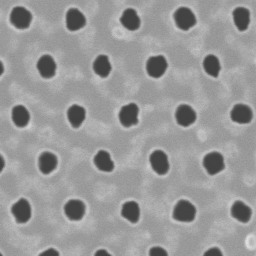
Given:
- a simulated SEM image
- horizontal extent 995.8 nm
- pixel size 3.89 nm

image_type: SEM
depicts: a regular array of holes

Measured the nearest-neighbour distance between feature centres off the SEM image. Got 0.209 microns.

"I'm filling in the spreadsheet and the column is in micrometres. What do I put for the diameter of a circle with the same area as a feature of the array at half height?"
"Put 0.0802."